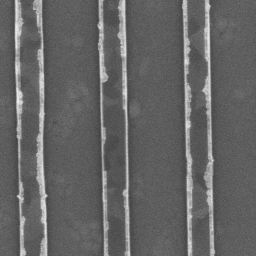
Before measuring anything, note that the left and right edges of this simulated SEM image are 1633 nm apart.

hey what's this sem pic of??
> one or a few lines or trenches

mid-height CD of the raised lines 156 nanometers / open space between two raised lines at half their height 0.379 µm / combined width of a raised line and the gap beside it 534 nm